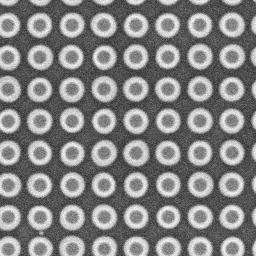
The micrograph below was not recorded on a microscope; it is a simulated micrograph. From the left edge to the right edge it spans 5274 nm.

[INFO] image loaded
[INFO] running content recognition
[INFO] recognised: an array of small figures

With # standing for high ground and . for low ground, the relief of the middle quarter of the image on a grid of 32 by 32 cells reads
####....####....####....####....
................................
................................
........###......##.............
####...######..######..#####....
#####..######..######..######..#
#####..######..######..######..#
#####..######..######..######..#
####....####....####....####....
................................
................................
.##......##......##......##.....
####....####....####....####...#
#####..######..######..######..#
#####..######..######..######..#
#####..######..######..######..#
####....####....####....####....
................................
................................
.........###.....###.....##.....
####....#####...#####...####....
#####..######..######..######..#
#####..######..######..######..#
#####..######..######..######..#
####....####....####....####....
................................
................................
.##......##......##......##.....
#####...####....####....#####..#
#####..######..######..######..#
#####..######..######..######..#
#####..######..######...#####..#